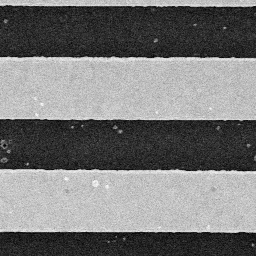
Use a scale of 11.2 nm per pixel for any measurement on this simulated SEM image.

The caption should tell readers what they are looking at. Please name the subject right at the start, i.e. lines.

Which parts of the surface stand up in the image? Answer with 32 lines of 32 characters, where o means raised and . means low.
oooooooooooooooooooooooooooooooo
................................
................................
................................
................................
................................
................................
oooooooooooooooooooooooooooooooo
oooooooooooooooooooooooooooooooo
oooooooooooooooooooooooooooooooo
oooooooooooooooooooooooooooooooo
oooooooooooooooooooooooooooooooo
oooooooooooooooooooooooooooooooo
oooooooooooooooooooooooooooooooo
oooooooooooooooooooooooooooooooo
................................
................................
................................
................................
................................
................................
oooooooooooooooooooooooooooooooo
oooooooooooooooooooooooooooooooo
oooooooooooooooooooooooooooooooo
oooooooooooooooooooooooooooooooo
oooooooooooooooooooooooooooooooo
oooooooooooooooooooooooooooooooo
oooooooooooooooooooooooooooooooo
oooooooooooooooooooooooooooooooo
................................
................................
................................